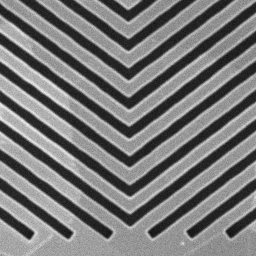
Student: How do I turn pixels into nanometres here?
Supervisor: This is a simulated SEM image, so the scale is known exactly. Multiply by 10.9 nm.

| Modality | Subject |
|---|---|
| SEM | groups of lines, slits or small figures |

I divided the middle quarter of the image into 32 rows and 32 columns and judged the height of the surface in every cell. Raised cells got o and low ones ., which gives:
o.....ooooo.....o....ooooo.....o
oo.....ooooo........ooooo.....oo
oooo.....ooooo....oooooo....oooo
ooooo.....ooooo..ooooo.....ooooo
.oooooo....oooooooooo.....ooooo.
...ooooo.....oooooo.....ooooo...
....ooooo.....oooo.....ooooo....
o....oooooo....oo.....ooooo.....
oo.....ooooo........ooooo.....oo
ooo.....ooooo......ooooo.....ooo
ooooo.....ooooo...ooooo.....oooo
.ooooo.....ooooo.ooooo....ooooo.
..ooooo.....oooooooo.....ooooo..
....ooooo.....ooooo.....ooooo...
.....ooooo.....ooo....ooooo.....
oo.....ooooo.........ooooo.....o
ooo.....ooooo.......ooooo....ooo
oooo.....ooooo....ooooo.....oooo
oooooo....oooooo.ooooo.....ooooo
..ooooo.....ooooooooo....ooooo..
...ooooo.....oooooo.....ooooo...
.....ooooo.....ooo.....ooooo....
o.....ooooo.....o.....ooooo....o
oo.....ooooo........ooooo.....oo
oooo.....ooooo.....ooooo.....ooo
ooooo.....ooooo...ooooo....ooooo
..oooo.....oooooooooo.....ooooo.
...ooooo.....ooooooo.....ooooo..
....ooooo.....ooooo....ooooo....
o....oooooo.....oo....ooooo.....
oo.....ooooo.........ooooo.....o
oooo.....ooooo.....ooooo.....ooo